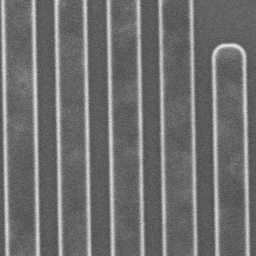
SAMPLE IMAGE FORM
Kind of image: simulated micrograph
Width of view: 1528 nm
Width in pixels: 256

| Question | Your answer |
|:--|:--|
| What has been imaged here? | parallel lines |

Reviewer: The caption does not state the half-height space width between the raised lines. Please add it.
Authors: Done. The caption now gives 0.123 micrometres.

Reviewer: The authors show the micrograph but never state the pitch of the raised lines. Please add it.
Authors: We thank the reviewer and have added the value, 0.313 micrometres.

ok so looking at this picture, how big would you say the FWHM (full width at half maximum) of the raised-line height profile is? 192 nanometres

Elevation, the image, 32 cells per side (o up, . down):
oooo...oooo...ooo...oooo........
oooo...oooo...ooo...oooo........
oooo...oooo...ooo...oooo........
oooo...oooo...ooo...oooo........
oooo...oooo...ooo...oooo........
oooo...oooo...ooo...oooo........
oooo...oooo...ooo...oooo...ooo..
oooo...oooo...ooo...oooo...oooo.
oooo...oooo...ooo...oooo...oooo.
oooo...oooo...oooo..oooo...oooo.
.ooo...oooo...oooo..oooo...oooo.
.ooo...oooo...oooo..oooo...oooo.
.ooo...oooo...oooo..oooo...oooo.
.ooo...oooo...oooo..oooo...oooo.
.oooo..oooo...oooo..oooo...oooo.
.oooo..oooo...oooo..oooo...oooo.
.oooo..oooo...oooo..oooo...oooo.
.oooo..oooo...oooo..oooo...oooo.
.oooo..oooo...oooo..oooo...oooo.
.oooo..oooo...oooo..oooo...oooo.
.oooo..oooo...oooo..oooo...oooo.
.oooo..oooo...oooo..oooo...oooo.
.oooo..oooo...oooo..oooo...oooo.
.oooo..oooo...oooo..oooo...oooo.
.oooo..oooo...oooo..oooo...oooo.
.oooo..oooo...oooo..oooo...oooo.
.oooo...ooo...oooo..oooo...oooo.
.oooo...ooo...oooo...ooo...oooo.
.oooo...ooo...oooo...ooo...oooo.
.oooo...ooo...oooo...ooo...oooo.
.oooo...ooo...oooo...ooo...oooo.
.oooo...ooo...oooo...ooo...oooo.